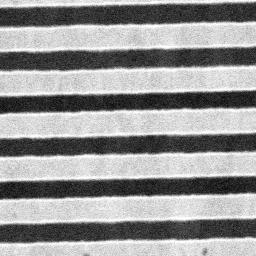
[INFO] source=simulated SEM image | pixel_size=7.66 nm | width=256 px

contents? lines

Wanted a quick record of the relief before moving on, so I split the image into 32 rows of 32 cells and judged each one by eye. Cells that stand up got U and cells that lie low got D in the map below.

UUUUUUUUUUUUUUUUUUUDDDDDDDDDDDDD
DDDDDDDDDDDDDDDDDDDDDDDDDDDDDDDD
DDDDDDDDDDDDDDDDDDDDDDDDDDDDDDDD
DUUUUUUUUUUUUUUUUUUUUUUUUUUUUUUU
UUUUUUUUUUUUUUUUUUUUUUUUUUUUUUUU
UUUUUUUUUUUUUUUUUUUUUUUUUUUUUUUU
DDDDDDDDDDDDDDDDDDDDDDDDDDDDDDDD
DDDDDDDDDDDDDDDDDDDDDDDDDDDDDDDD
DDDDDDDDDDDDDDDDDDDDDDUDDDUUUUUU
UUUUUUUUUUUUUUUUUUUUUUUUUUUUUUUU
UUUUUUUUUUUUUUUUUUUUUUUUUUUUUUUU
UUUUUUUUUUUUUUUUUUUUUUDDDDDDDDDD
DDDDDDDDDDDDDDDDDDDDDDDDDDDDDDDD
DDDDDDDDDDDDDDDDDDDDDDDDDDDDDDDU
UUUUUUUUUUUUUUUUUUUUUUUUUUUUUUUU
UUUUUUUUUUUUUUUUUUUUUUUUUUUUUUUU
UUUUUUUUUUUUUUUUUUUUUUUUUUUUUUUU
DDDDDDDDDDDDDDDDDDDDDDDDDDDDDDDD
DDDDDDDDDDDDDDDDDDDDDDDDDDDDDDDD
DDDDDDDDDUUUUUUUUUUUUUUUUUUUUUUU
UUUUUUUUUUUUUUUUUUUUUUUUUUUUUUUU
UUUUUUUUUUUUUUUUUUUUUUUUUUUUUUUU
UUUUUDDDDDDDDDDDDDDDDDDDDDDDDDDD
DDDDDDDDDDDDDDDDDDDDDDDDDDDDDDDD
DDDDDDDDDDDDDDDDDDDDDDDUUUUUUUUU
UUUUUUUUUUUUUUUUUUUUUUUUUUUUUUUU
UUUUUUUUUUUUUUUUUUUUUUUUUUUUUUUU
UUUUUUUUUUUUUUUUUUUUUDUUDDDDDDDD
DDDDDDDDDDDDDDDDDDDDDDDDDDDDDDDD
DDDDDDDDDDDDDDDDDDDDDDDDDDDDDDDD
UUUUUUUUUUUUUUUUUUUUUUUUUUUUUUUU
UUUUUUUUUUUUUUUUUUUUUUUUUUUUUUUU